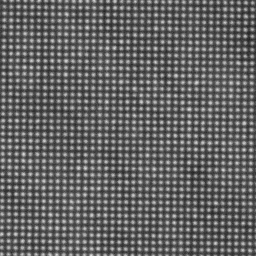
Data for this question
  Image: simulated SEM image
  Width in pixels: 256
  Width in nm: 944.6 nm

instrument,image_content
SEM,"a regular array of raised bodies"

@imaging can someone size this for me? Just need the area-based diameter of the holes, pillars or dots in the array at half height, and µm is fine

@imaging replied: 0.0125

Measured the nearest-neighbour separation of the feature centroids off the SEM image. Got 24.1 nanometers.